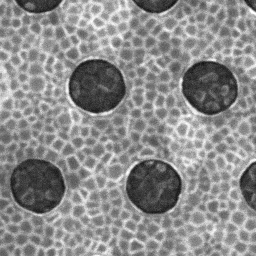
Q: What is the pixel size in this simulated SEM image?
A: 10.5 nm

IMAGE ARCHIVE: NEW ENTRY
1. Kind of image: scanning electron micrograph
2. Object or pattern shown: holes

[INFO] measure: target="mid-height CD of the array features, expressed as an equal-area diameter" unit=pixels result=55.8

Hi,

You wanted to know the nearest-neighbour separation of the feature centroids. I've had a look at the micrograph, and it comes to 1190 nm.